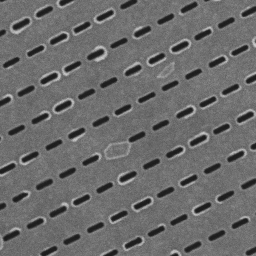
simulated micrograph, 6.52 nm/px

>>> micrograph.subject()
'a regular array of holes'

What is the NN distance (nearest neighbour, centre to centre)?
169 nanometers